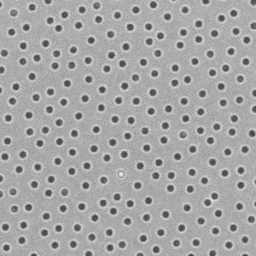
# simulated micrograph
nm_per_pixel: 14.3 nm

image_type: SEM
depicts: a regular array of holes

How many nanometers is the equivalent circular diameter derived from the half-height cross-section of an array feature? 118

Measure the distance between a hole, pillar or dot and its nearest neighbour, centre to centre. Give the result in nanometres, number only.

228